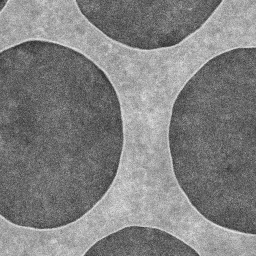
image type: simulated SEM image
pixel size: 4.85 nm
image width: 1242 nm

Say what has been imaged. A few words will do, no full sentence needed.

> holes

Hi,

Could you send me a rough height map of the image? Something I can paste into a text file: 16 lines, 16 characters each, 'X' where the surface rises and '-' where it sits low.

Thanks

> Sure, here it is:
XXXXX---------XX
XXXXXX-------XXX
XXXXXXX----XXXXX
-----XXXXXXXXX--
------XXXXXX----
-------XXXX-----
-------XXXX-----
--------XXX-----
--------XXX-----
--------XXX-----
-------XXXX-----
-------XXXX-----
------XXXXXX----
-----XXXXXXXX---
XXXXXXX---XXXXX-
XXXXXX------XXXX